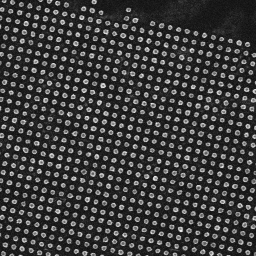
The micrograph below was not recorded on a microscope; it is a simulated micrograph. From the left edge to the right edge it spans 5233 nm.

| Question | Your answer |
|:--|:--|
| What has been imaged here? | a regular array of raised bodies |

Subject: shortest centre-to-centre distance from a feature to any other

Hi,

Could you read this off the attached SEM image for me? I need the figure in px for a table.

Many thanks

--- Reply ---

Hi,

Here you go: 8.57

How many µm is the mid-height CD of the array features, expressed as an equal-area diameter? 0.0893